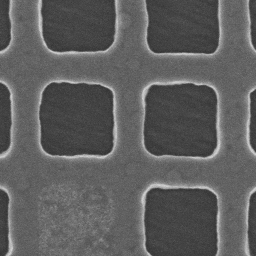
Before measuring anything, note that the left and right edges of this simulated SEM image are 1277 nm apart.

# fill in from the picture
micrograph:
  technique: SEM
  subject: holes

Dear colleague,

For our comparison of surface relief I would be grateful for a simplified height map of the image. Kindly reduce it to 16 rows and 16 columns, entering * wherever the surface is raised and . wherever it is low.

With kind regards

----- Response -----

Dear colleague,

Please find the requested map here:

.**....**.....**
.**....**.....**
.**....**.....**
****************
****************
***....**....***
.**....**.....**
.*.....**.....**
.**....**.....**
***....**....***
****************
****************
.********.....**
.********.....**
.********.....*.
.********.....*.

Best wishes